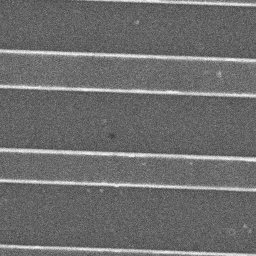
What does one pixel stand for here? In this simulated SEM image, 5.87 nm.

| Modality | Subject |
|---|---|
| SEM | one or a few lines or trenches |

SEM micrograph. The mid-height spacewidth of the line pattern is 364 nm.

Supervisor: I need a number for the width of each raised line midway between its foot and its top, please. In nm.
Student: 207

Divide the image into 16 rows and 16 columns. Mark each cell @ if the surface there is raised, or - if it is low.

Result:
----------------
----------------
----------------
@@@@@@@@@-------
@@@@@@@@@@@@@@@@
--@@@@@@@@@@@@@@
----------------
----------------
----------------
@@@@@-----------
@@@@@@@@@@@@@@@@
-----@@@@@@@@@@@
----------------
----------------
----------------
@@@@------------